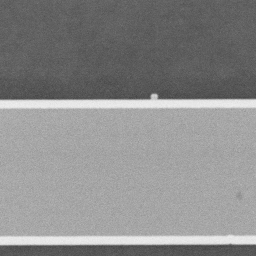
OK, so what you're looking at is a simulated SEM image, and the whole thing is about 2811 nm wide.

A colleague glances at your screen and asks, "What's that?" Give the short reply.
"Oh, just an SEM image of one or a few lines or trenches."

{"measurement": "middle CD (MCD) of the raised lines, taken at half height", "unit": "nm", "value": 1500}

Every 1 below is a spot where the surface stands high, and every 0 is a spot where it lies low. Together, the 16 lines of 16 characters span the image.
0000000000000000
0000000000000000
0000000000000000
0000000000000000
0000000000000000
0000000000000000
0000000000000001
1111111111111111
1111111111111111
1111111111111111
1111111111111111
1111111111111111
1111111111111111
1111111111111111
1111111111111111
0000000000000000